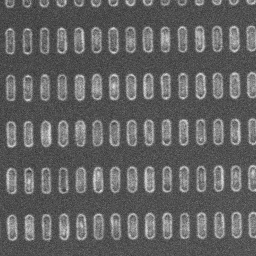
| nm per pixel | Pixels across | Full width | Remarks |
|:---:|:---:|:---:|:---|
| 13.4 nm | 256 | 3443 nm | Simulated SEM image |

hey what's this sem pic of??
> a regular array of holes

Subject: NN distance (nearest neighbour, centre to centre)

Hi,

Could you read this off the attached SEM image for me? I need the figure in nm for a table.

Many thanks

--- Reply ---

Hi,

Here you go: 230